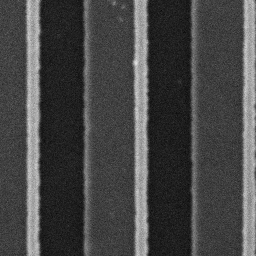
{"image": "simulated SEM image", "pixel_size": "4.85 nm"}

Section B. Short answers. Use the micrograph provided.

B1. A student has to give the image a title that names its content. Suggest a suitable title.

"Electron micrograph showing lines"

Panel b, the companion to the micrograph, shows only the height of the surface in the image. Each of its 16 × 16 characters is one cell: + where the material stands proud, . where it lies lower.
++...++++...++++
++...++++...++++
++...++++...++++
++...++++...++++
++...++++...++++
++...++++...++++
++...++++...++++
++...++++...++++
++...++++...++++
++...++++...++++
++...++++...++++
++...++++...++++
++...++++...++++
++...++++...++++
++...++++...++++
++...++++...++++